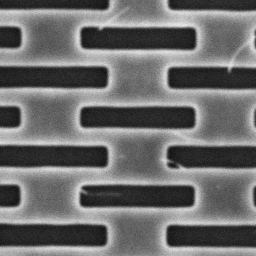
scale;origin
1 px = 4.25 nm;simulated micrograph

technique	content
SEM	groups of lines, slits or small figures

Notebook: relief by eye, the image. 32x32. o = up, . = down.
..............ooooooo...........
ooooooooooooooooooooooooooooo..o
oooooooooooooooooooooooooooooooo
..oooooooo..............oooooooo
...ooooooo...............ooooooo
...ooooooo...............ooooooo
oooooooooooooooooooooooooooooooo
oooooooooooooooooooooooooooooooo
.............oooooooo...........
..............ooooooo...........
.............oooooooo...........
oooooooooooooooooooooooooooooooo
oooooooooooooooooooooooooooooooo
..oooooooo..............oooooooo
...ooooooo...............ooooooo
...ooooooo..............oooooooo
oooooooooooooooooooooooooooooooo
oooooooooooooooooooooooooooooooo
.............oooooooo...........
..............ooooooo...........
.............oooooooo...........
oooooooooooooooooooooooooooooooo
oooooooooooooooooooooooooooooooo
..oooooooo..............oooooooo
...ooooooo..............oooooooo
..oooooooo..............oooooooo
oooooooooooooooooooooooooooooooo
oooooooooooooooooooooooooooooooo
.............oooooooo...........
..............ooooooo...........
.............oooooooo...........
oooooooooooooooooooooooooooooooo